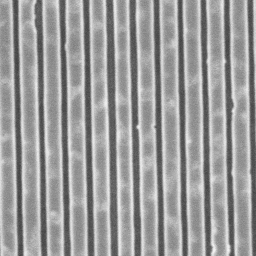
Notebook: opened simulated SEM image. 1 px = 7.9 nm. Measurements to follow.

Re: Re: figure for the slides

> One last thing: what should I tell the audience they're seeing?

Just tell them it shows parallel lines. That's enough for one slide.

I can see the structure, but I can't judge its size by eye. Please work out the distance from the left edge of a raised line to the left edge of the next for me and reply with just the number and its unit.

23.5 pixels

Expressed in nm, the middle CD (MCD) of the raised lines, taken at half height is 127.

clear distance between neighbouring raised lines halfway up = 59.2 nm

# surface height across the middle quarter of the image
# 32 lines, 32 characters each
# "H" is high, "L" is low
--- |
LHHHHLLHHHLLLHHHLLLHHHLLHHHHLLHH
LHHHHLLHHHLLLHHHLLLHHHHLHHHHLLHH
LHHHHLLHHHLLLHHHLLLHHHHLHHHHLLHH
LHHHHLLHHHHLLHHHLLLHHHHLHHHHLLHH
LHHHHLLHHHHLLHHHLLLHHHHLHHHHLLHH
LHHHHLLHHHHLLHHHLLLHHHHLHHHHLLHH
LHHHHLLHHHHLLHHHLLLHHHHLHHHHLLHH
LHHHHLLHHHHLLHHHLLLHHHHLLHHHHLLH
LHHHHLLHHHHLLHHHHLLHHHHLLHHHHLLH
LHHHHLLHHHHLLHHHHLLHHHHLLHHHHLLH
LHHHHLLHHHHLLHHHHLLHHHHLLHHHHLHH
LHHHHLLHHHHLLHHHHLLHHHHLLHHHHLHH
LHHHHLLHHHHLLHHHHLLHHHLLLHHHHLLH
LHHHHLLHHHHLLHHHHLLHHHHLLHHHHLLH
LHHHHLLHHHHLLHHHHLLHHHHLLHHHHLLH
LHHHHLLHHHHLLHHHHLLHHHHLLHHHHLLH
LHHHHLLHHHHLLHHHHLLHHHHLLHHHHLLH
LHHHHLLHHHHLLHHHHLLHHHHLLHHHHLLH
LHHHHLLHHHHLLHHHHLLHHHHLLHHHHLLH
LHHHHLLHHHHLLHHHHLLHHHHLLHHHHLLH
LHHHHLLHHHHLLHHHHLLHHHHLLHHHHLLH
LHHHHLLHHHHLLHHHHLLHHHHLLHHHHLLH
LHHHHLLHHHHLLHHHHLLHHHHLLHHHHLLH
LHHHHLLHHHHLLHHHHLLHHHHLLHHHHLLH
LHHHHLLHHHHLLLHHHLLHHHHLLHHHHLLH
LHHHHLLHHHHLLLHHHLLHHHHLLHHHHLLH
LLHHHLLHHHHLLLHHHLLHHHHLLHHHHLLH
LLHHHLLHHHHLLLHHHLLHHHHLLHHHHLLH
LLHHHLLHHHHLLLHHHLLHHHHLLHHHHLLH
LLHHHLLHHHHLLLHHHLLHHHHLLHHHHLLH
LLHHHLLHHHHLLLHHHLLHHHHLLHHHHLLH
LLHHHLLLHHHLLLHHHLLHHHHLLHHHHLLH